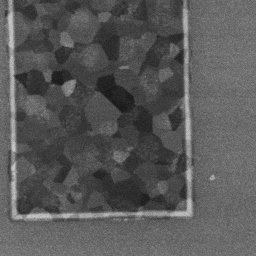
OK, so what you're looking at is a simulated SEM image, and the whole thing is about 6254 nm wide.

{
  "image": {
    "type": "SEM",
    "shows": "one or a few lines or trenches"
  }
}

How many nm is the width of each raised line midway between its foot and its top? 4270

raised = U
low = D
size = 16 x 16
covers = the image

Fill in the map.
DUUUUUUUUUUUDDDD
DUUUUUUUUUUUDDDD
DUUUUUUUUUUUDDDD
DUUUUUUUUUUUDDDD
DUUUUUUUUUUUDDDD
DUUUUUUUUUUUDDDD
DUUUUUUUUUUUDDDD
DUUUUUUUUUUUDDDD
DUUUUUUUUUUUDDDD
DUUUUUUUUUUUDDDD
DUUUUUUUUUUUDDDD
DUUUUUUUUUUUDDDD
DUUUUUUUUUUUDDDD
DUDDDDDDDDDDDDDD
DDDDDDDDDDDDDDDD
DDDDDDDDDDDDDDDD